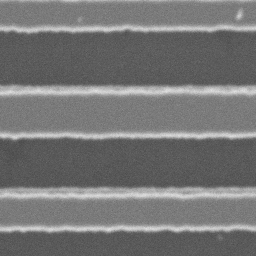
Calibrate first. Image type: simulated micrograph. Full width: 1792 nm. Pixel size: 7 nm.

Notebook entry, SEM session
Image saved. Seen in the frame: lines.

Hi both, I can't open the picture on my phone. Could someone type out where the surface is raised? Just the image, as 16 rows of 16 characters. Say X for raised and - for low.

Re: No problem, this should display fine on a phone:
XXXXXXXXXXXXXXXX
XXXXXXXXXXXXXXXX
----------------
----------------
----------------
XXXXXXXXXXXXXXXX
XXXXXXXXXXXXXXXX
XXXXXXXXXXXXXXXX
XXXXXXXXXXXXXXXX
----------------
----------------
----------------
XXXXXXXXXXXXXXXX
XXXXXXXXXXXXXXXX
----------------
----------------